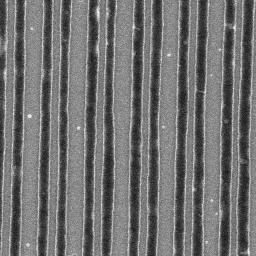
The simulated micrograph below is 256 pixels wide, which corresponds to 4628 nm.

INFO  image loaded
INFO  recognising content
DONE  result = parallel lines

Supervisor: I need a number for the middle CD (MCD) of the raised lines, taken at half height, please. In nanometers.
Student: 190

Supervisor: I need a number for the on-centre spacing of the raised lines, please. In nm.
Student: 411